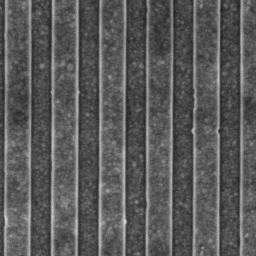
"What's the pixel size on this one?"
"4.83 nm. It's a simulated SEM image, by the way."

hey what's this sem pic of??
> parallel lines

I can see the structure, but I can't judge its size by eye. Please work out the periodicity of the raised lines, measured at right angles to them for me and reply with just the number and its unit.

228 nm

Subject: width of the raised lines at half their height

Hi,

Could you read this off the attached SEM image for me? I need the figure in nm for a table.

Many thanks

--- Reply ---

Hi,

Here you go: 125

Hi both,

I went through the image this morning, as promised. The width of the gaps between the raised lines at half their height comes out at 103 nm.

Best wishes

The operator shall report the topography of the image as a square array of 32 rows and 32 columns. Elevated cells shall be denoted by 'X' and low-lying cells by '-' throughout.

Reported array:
-XXX---XXX--XXXX--XXX---XXX---XX
-XXX---XXX--XXXX--XXX---XXX---XX
-XXX---XXX--XXXX--XXXX--XXX---XX
-XXX---XXX--XXXX--XXXX--XXX---XX
-XXX---XXX--XXXX--XXXX--XXX---XX
-XXX---XXX--XXXX--XXXX--XXX---XX
-XXX---XXX--XXXX--XXXX--XXX---XX
-XXX---XXX--XXXX--XXXX--XXX---XX
-XXX---XXX--XXXX--XXXX--XXX---XX
-XXX---XXX---XXX--XXXX--XXX---XX
-XXX---XXX---XXX--XXXX--XXX---XX
-XXX--XXXX---XXX--XXXX--XXX---XX
-XXX---XXX---XXX--XXX---XXX---XX
-XXX---XXX---XXX--XXX---XXX---XX
-XXX---XXX---XXX--XXX---XXX---XX
-XXX---XXX---XXX--XXX---XXX---XX
-XXX---XXX---XXX--XXX---XXX---XX
-XXX---XXX---XXX--XXXX--XXX---XX
-XXX---XXX---XXX--XXXX--XXX---XX
-XXX---XXX---XXX--XXX---XXX---XX
-XXX---XXX---XXX--XXX---XXX---XX
-XXX---XXX---XXX--XXX---XXX---XX
-XXX---XXX---XXX--XXX---XXX---XX
-XXX---XXX---XXX--XXX---XXX---XX
-XXX---XXX--XXXX--XXX---XXX---XX
-XXX---XXX--XXXX--XXX---XXX---XX
-XXX---XXX--XXXX--XXX---XXX---XX
-XXX--XXXX---XXX--XXX---XXX---XX
-XXX--XXXX---XXX--XXX---XXX---XX
-XXX--XXXX--XXXX--XXX---XXX---XX
-XXX--XXXX--XXXX--XXX---XXX---XX
-XXX--XXXX--XXXX--XXX---XXX---XX